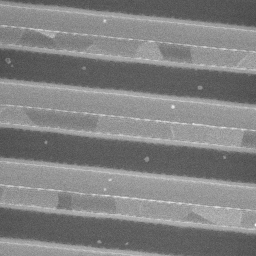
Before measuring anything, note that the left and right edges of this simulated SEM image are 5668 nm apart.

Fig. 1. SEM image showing lines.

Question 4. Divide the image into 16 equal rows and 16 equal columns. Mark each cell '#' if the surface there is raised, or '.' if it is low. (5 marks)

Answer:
##..............
############....
################
.......#########
................
####............
#############...
################
.......#########
................
####............
##############..
################
........########
................
####............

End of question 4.